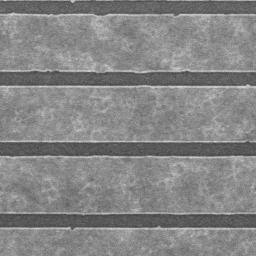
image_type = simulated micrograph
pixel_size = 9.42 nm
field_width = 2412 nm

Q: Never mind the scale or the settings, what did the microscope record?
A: one or a few lines or trenches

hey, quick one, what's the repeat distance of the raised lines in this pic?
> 0.67 microns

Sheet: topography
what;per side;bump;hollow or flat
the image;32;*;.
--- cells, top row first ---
................................
................................
********************************
********************************
********************************
********************************
********************************
********************************
********************************
................................
................................
********************************
********************************
********************************
********************************
********************************
********************************
********************************
................................
................................
********************************
********************************
********************************
********************************
********************************
********************************
********************************
................................
................................
********************************
********************************
********************************